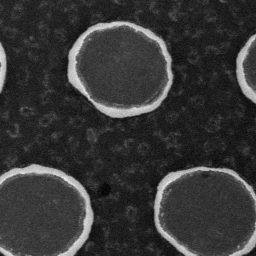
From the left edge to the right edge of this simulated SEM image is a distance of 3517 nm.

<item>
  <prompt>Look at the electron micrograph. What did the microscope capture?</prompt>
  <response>raised bodies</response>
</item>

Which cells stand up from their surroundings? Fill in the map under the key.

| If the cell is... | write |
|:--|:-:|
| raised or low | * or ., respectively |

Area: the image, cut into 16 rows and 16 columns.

................
.......*........
.....*****......
.....*****.....*
....*******....*
.....******....*
......****......
................
................
................
................
*****.....*****.
*****.....******
******....******
*****.....******
*****......****.